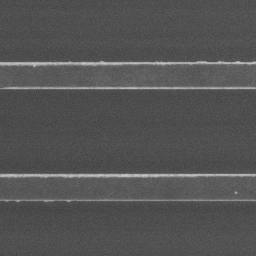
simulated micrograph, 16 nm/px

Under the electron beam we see lines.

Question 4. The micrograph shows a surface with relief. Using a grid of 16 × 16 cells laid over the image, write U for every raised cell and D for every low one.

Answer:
DDDDDDDDDDDDDDDD
DDDDDDDDDDDDDDDD
DDDDDDDDDDDDDDDD
DDDDDDDDDDDDDDDD
UUUUUUUUUUUUUUUU
UUUUUUUUUUUUUUUU
DDDDDDDDDDDDDDDD
DDDDDDDDDDDDDDDD
DDDDDDDDDDDDDDDD
DDDDDDDDDDDDDDDD
DDDDDDDDDDDDDDDD
UUUUUUUUUUUUUUUU
UUUUUUUUUUUUUUUU
DDDDDDDDDDDDDDDD
DDDDDDDDDDDDDDDD
DDDDDDDDDDDDDDDD